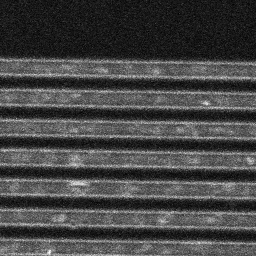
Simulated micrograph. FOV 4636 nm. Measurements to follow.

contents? parallel lines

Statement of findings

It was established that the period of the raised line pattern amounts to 542 nanometers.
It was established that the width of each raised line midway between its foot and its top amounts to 303 nm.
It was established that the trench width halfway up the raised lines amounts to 240 nm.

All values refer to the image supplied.